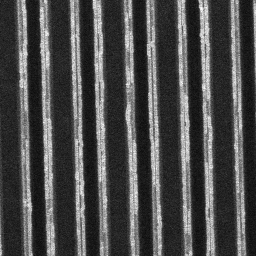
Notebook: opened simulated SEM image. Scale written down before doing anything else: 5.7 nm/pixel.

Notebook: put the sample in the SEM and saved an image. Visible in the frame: parallel lines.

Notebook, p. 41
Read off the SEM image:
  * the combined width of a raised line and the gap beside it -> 152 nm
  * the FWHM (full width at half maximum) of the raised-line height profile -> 56.3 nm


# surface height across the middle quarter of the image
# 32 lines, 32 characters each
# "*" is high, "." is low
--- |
..**....**.....***...**......**.
..**....**.....***...**......**.
..**....**.....***...**......**.
..**....**.....***...**......**.
..**....**.....***...**......**.
..***...**.....***...**......**.
..***...**.....***...**......**.
..***...**.....***...**......**.
..***...**......**...**......**.
..***...**......**...**......**.
..***...**......**...**......**.
..***...**.....***...**......**.
..***...**.....***...**......**.
..***...**......**...**......**.
...**...**......**...**......**.
..***...**......**...**......**.
..***...**......**...***.....**.
..***...**......**...***.....**.
..***...**......**....**.....**.
..***...**......**....**.....**.
..***...**......**....**.....**.
...**...**......**....**.....**.
...**...**......**....**.....***
...**...**......**....**.....***
...**...**......**....**.....***
...**...**......**....**.....***
...**...**......**....**......**
...**...***.....**....**......**
...**...***.....**....**......**
...**...***.....**....**......**
...**...***.....**....**......**
...**....**.....***...**......**